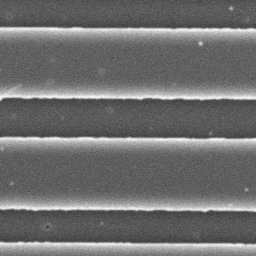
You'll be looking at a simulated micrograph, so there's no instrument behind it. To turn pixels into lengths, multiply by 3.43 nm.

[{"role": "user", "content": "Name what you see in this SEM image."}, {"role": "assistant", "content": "lines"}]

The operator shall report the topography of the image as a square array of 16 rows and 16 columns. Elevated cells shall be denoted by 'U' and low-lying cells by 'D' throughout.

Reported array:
DDDDDDDDDDDDDDDD
DDDDDDDDDDDDDDDD
UUUUUUUUUUUUUUUU
UUUUUUUUUUUUUUUU
UUUUUUUUUUUUUUUU
UUUUUUUUUUUUUUUU
DDDDDDDDDDDDDDDD
DDDDDDDDDDDDDDDD
DDDDDDDDDDDDDDDD
UUUUUUUUUUUUUUUU
UUUUUUUUUUUUUUUU
UUUUUUUUUUUUUUUU
UUUUUUUUUUUUUUUU
DDDDDDDDDDDDDDDD
DDDDDDDDDDDDDDDD
UUUUUUUUUUUUUUUU